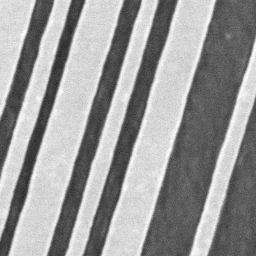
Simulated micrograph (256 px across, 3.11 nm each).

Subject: lines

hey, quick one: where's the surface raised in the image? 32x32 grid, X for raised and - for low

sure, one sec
XXXX---XX--XXXX---XX--XXXXX-----
XXXX--XX--XXXXX--XX---XXXXX-----
XXXX--XX--XXXXX--XX---XXXX------
XXX---XX--XXXX---XX--XXXXX------
XXX--XXX-XXXXX--XX---XXXXX------
XXX--XX--XXXXX--XX---XXXX-------
XXX--XX--XXXX---XX--XXXXX-------
XX---XX-XXXXX---XX--XXXXX------X
XX--XX--XXXXX--XX---XXXX-------X
XX--XX--XXXXX--XX--XXXXX-------X
X---XX--XXXX---XX--XXXXX------XX
X--XXX-XXXXX--XX---XXXX-------XX
X--XX--XXXXX--XX---XXXX-------XX
---XX--XXXX---XX--XXXXX------XX-
--XXX-XXXXX--XX---XXXXX------XX-
--XX--XXXXX--XX---XXXX-------XX-
--XX--XXXX---XX---XXXX------XX--
--XX-XXXXX---XX--XXXXX------XX--
-XX--XXXXX--XX---XXXX-------XX--
-XX--XXXXX--XX--XXXXX------XXX--
-XX-XXXXX---XX--XXXXX------XX---
XXX-XXXXX--XX---XXXXX------XX---
XX--XXXXX--XX---XXXX-------XX---
XX--XXXX---XX--XXXXX------XX----
XX-XXXXX--XXX--XXXXX------XX----
X--XXXXX--XX---XXXX-------XX----
X--XXXXX--XX--XXXXX------XX-----
X-XXXXX---XX--XXXXX------XX-----
--XXXXX--XX---XXXX-------XX-----
--XXXXX--XX--XXXXX-------XX-----
-XXXXX---XX--XXXXX------XX------
-XXXXX--XX---XXXXX------XX------